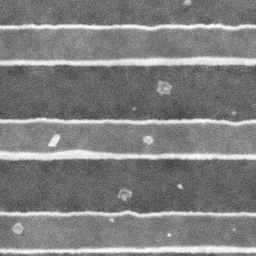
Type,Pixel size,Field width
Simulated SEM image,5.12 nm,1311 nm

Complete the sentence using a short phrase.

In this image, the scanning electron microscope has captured lines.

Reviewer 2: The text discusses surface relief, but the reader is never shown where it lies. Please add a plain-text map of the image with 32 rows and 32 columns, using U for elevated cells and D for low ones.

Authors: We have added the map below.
DDDDDDDDDDDDDDDDDDDDDDDDDDDDDDDD
DDDDDDDDDDDDDDDDDDDDDDDDDDDDDDDD
DDDDDDDDDDDDDDDDDDDDDDDDDDDDDDDD
UUUUUUUUUUUUUUUUUUUUUUUUUUUUUUUU
UUUUUUUUUUUUUUUUUUUUUUUUUUUUUUUU
UUUUUUUUUUUUUUUUUUUUUUUUUUUUUUUU
UUUUUUUUUUUUUUUUUUUUUUUUUUUUUUUU
UUUUUUUUUUUUUUUUUUUUUUUUUUUUUUUU
DDDDDDDDDDDDDDDDDDDDDDDDDDDDDDDD
DDDDDDDDDDDDDDDDDDDDDDDDDDDDDDDD
DDDDDDDDDDDDDDDDDDDDDDDDDDDDDDDD
DDDDDDDDDDDDDDDDDDDDDDDDDDDDDDDD
DDDDDDDDDDDDDDDDDDDDDDDDDDDDDDDD
DDDDDDDDDDDDDDDDDDDDDDDDDDDDDDDD
DDDDDDDDDDDDDDDDDDDDDDDDDDDDDDDD
UUUUUUUUUUUUUUUUUUUUUUUUUUUUUUUU
UUUUUUUUUUUUUUUUUUUUUUUUUUUUUUUU
UUUUUUUUUUUUUUUUUUUUUUUUUUUUUUUU
UUUUUUUUUUUUUUUUUUUUUUUUUUUUUUUU
UUUUUUUUDDDDUUUUUUUUUUUUUUUUUUUU
DDDDDDDDDDDDDDDDDDDDDDDDDDDDDDDD
DDDDDDDDDDDDDDDDDDDDDDDDDDDDDDDD
DDDDDDDDDDDDDDDDDDDDDDDDDDDDDDDD
DDDDDDDDDDDDDDDDDDDDDDDDDDDDDDDD
DDDDDDDDDDDDDDDDDDDDDDDDDDDDDDDD
DDDDDDDDDDDDDDDDDDDDDDDDDDDDDDDD
DDDDDDDDDDDDDDDUUDDDDDDDDDDDDDDD
UUUUUUUUUUUUUUUUUUUUUUUUUUUUUUUU
UUUUUUUUUUUUUUUUUUUUUUUUUUUUUUUU
UUUUUUUUUUUUUUUUUUUUUUUUUUUUUUUU
UUUUUUUUUUUUUUUUUUUUUUUUUUUUUUUU
DDUUDDUUDUDDDDDDDDDDDDDDDDDDDDDD